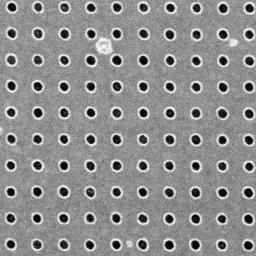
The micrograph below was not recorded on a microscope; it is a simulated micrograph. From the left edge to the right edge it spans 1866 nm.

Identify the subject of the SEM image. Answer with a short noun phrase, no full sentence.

a regular array of holes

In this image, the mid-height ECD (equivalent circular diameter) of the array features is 0.0741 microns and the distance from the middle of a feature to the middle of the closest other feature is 0.19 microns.